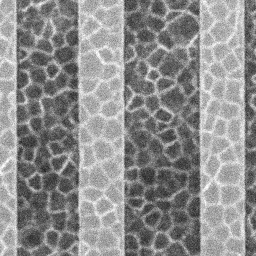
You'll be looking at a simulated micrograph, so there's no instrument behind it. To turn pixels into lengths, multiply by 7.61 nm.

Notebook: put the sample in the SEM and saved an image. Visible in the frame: one or a few lines or trenches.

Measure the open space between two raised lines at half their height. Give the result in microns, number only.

0.482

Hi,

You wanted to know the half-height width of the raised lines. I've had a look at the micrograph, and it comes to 329 nm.